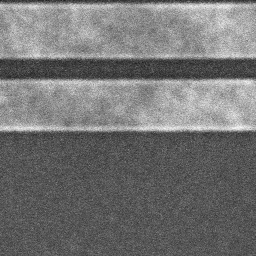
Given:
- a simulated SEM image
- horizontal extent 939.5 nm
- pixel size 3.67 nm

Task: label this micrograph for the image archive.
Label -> one or a few lines or trenches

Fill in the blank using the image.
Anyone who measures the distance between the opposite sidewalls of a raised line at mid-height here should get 184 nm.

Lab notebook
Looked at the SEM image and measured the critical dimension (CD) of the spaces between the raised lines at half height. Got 85.8 nm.